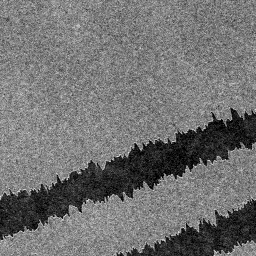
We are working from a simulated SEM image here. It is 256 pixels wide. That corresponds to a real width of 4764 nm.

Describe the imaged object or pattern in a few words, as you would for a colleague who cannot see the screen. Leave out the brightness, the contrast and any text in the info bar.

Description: one or a few lines or trenches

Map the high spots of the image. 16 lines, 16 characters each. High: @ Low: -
@@@@@@@@@@@@@@@@
@@@@@@@@@@@@@@@@
@@@@@@@@@@@@@@@@
@@@@@@@@@@@@@@@@
@@@@@@@@@@@@@@@@
@@@@@@@@@@@@@@@@
@@@@@@@@@@@@@@@@
@@@@@@@@@@@@@---
@@@@@@@@@@@-----
@@@@@@@@-------@
@@@@@-------@@@@
@@@-------@@@@@@
-------@@@@@@@@@
----@@@@@@@@@@--
-@@@@@@@@@@-----
@@@@@@@@@------@